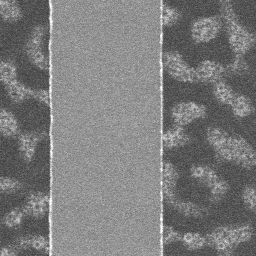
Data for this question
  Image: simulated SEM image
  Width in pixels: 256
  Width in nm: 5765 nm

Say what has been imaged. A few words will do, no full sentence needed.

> one or a few lines or trenches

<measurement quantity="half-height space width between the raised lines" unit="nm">2480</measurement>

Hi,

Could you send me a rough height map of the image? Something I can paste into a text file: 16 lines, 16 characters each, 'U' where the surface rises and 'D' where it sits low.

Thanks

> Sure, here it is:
UUUDDDDDDDUUUUUU
UUUDDDDDDDUUUUUU
UUUDDDDDDDUUUUUU
UUUDDDDDDDUUUUUU
UUUDDDDDDDUUUUUU
UUUDDDDDDDUUUUUU
UUUDDDDDDDUUUUUU
UUUDDDDDDDUUUUUU
UUUDDDDDDDUUUUUU
UUUDDDDDDDUUUUUU
UUUDDDDDDDUUUUUU
UUUDDDDDDDUUUUUU
UUUDDDDDDDUUUUUU
UUUDDDDDDDUUUUUU
UUUDDDDDDDUUUUUU
UUUDDDDDDDUUUUUU